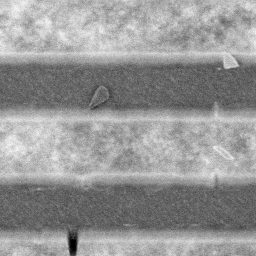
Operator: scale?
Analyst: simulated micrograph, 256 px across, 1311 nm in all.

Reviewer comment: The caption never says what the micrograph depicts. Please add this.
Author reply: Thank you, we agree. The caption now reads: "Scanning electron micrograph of one or a few lines or trenches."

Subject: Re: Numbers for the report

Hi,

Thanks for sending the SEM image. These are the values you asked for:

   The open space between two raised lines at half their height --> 290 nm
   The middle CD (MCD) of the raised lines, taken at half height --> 330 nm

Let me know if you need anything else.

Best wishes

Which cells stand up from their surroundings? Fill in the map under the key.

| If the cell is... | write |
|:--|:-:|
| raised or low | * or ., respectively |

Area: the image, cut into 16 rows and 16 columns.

****************
****************
****************
****************
................
................
................
****************
****************
****************
****************
................
................
................
................
****************